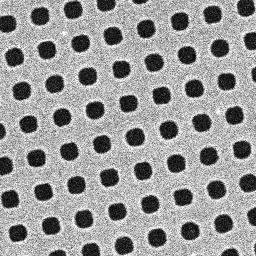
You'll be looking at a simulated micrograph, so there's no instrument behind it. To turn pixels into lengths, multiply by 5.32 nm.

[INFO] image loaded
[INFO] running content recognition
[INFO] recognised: a regular array of holes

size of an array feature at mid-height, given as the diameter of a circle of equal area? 100 nanometres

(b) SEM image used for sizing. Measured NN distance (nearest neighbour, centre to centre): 179 nm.